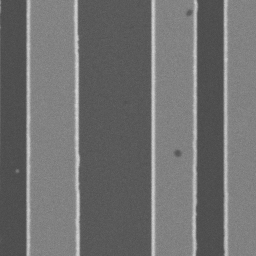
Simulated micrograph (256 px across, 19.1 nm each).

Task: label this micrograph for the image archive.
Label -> lines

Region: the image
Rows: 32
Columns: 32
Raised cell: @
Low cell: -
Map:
---@@@@@@@---------@@@@@@---@@@@
---@@@@@@@---------@@@@@@---@@@@
---@@@@@@@---------@@@@@@---@@@@
---@@@@@@@---------@@@@@@---@@@@
---@@@@@@@---------@@@@@@---@@@@
---@@@@@@@---------@@@@@@---@@@@
---@@@@@@@---------@@@@@@---@@@@
---@@@@@@@---------@@@@@@---@@@@
---@@@@@@@---------@@@@@@---@@@@
---@@@@@@@---------@@@@@@---@@@@
---@@@@@@@---------@@@@@@---@@@@
---@@@@@@@---------@@@@@@---@@@@
---@@@@@@@---------@@@@@@---@@@@
---@@@@@@@---------@@@@@@---@@@@
---@@@@@@@---------@@@@@@---@@@@
---@@@@@@@---------@@@@@@---@@@@
---@@@@@@@---------@@@@@@---@@@@
---@@@@@@@---------@@@@@@---@@@@
---@@@@@@@---------@@@@@@---@@@@
---@@@@@@@---------@@@@@@---@@@@
---@@@@@@@---------@@@@@@---@@@@
---@@@@@@@---------@@@@@@---@@@@
---@@@@@@@---------@@@@@----@@@@
---@@@@@@@---------@@@@@----@@@@
---@@@@@@@---------@@@@@----@@@@
---@@@@@@@---------@@@@@@---@@@@
---@@@@@@@---------@@@@@----@@@@
---@@@@@@@---------@@@@@----@@@@
---@@@@@@@---------@@@@@----@@@@
---@@@@@@@---------@@@@@----@@@@
---@@@@@@@---------@@@@@----@@@@
---@@@@@@@---------@@@@@----@@@@